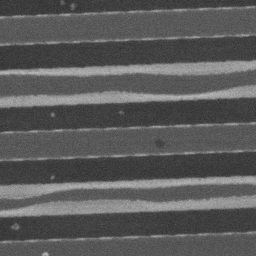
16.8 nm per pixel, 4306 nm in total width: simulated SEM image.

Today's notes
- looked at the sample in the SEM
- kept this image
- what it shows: lines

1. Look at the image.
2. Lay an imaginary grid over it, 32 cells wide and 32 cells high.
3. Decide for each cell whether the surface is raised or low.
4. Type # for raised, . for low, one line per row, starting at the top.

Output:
................................
................################
################################
################################
############################....
#####...........................
................................
................................
........................########
################################
################################
################################
###########.....................
................................
................................
............................####
...#############################
################################
################################
################................
................................
................................
...........................#####
....############################
################################
#############################...
####............................
................................
................................
......................##########
################################
################################